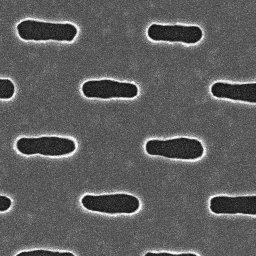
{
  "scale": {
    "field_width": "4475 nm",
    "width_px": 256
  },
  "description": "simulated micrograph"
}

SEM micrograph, holes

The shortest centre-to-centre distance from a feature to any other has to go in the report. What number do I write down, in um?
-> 1.5